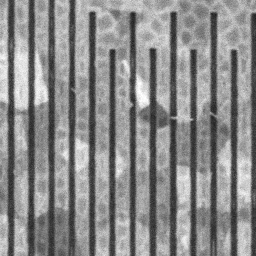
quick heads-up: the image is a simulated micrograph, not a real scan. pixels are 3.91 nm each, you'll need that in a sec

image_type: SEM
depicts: parallel lines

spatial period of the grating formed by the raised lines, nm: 79.4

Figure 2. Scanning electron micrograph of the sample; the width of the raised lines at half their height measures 48.4 nm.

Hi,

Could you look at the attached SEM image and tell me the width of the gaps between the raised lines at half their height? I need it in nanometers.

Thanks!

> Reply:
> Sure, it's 30.3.